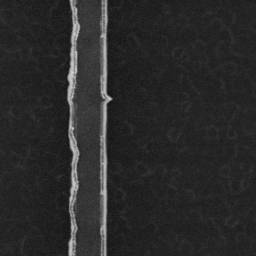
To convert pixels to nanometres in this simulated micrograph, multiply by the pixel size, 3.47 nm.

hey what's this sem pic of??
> one or a few lines or trenches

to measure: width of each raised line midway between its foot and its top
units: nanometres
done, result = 118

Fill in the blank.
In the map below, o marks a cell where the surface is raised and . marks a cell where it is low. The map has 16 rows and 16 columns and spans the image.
.....oo.........
.....oo.........
.....oo.........
....ooo.........
....ooo.........
....ooo.........
....ooo.........
....ooo.........
....ooo.........
.....oo.........
.....oo.........
.....oo.........
....ooo.........
....ooo.........
....ooo.........
....ooo.........